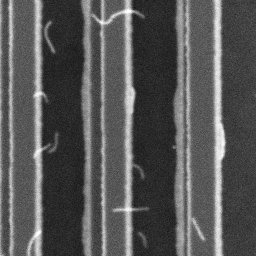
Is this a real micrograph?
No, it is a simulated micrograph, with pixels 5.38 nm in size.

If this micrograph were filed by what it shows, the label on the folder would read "lines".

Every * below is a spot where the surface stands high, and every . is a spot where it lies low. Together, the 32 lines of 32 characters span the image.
*****......*****.......****.....
*****......*****.......****.....
*****......*****.......****.....
*****......*****.......****.....
*****......*****.......****.....
*****......*****.......****.....
*****......*****.......****.....
*****......*****.......****.....
*****......*****.......****.....
*****......*****.......****.....
*****......*****.......****.....
*****......******......****.....
*****......******......****.....
*****......******......****.....
*****......*****.......****.....
*****......*****.......*****....
*****......*****.......*****....
*****......*****.......*****....
*****......*****.......*****....
*****......*****.......*****....
*****......*****.......*****....
*****......*****.......*****....
*****......*****.......*****....
*****......*****.......*****....
*****......*****.......*****....
*****......*****.......*****....
*****......*****.......*****....
*****......*****.......*****....
*****......*****.......*****....
*****......*****.......*****....
*****......*****.......*****....
*****......*****.......*****....